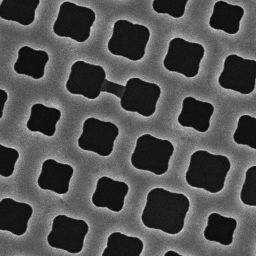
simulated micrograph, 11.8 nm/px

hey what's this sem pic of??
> a regular array of holes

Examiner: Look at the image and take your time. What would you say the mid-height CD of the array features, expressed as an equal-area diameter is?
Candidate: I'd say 38.1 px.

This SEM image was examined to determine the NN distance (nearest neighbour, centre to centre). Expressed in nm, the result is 680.